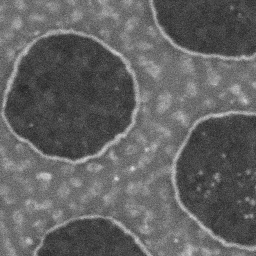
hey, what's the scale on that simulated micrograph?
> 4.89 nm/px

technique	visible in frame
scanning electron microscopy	raised bodies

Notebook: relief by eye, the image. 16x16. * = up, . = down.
.........*******
..........******
..****.....*****
.******......***
.*******........
*********.......
*********.......
********.....***
.*******....****
..****.....*****
...........*****
...........*****
...........*****
............****
...*****.....***
..*******......*